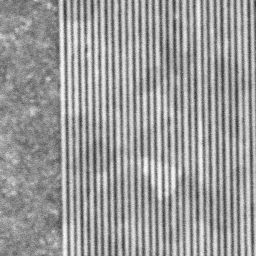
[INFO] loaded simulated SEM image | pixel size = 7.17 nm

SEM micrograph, parallel lines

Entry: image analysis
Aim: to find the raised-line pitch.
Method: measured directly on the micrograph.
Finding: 48.8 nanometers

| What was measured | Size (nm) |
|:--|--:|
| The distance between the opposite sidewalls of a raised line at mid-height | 23.3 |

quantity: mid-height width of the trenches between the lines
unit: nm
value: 23.3